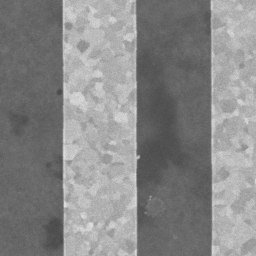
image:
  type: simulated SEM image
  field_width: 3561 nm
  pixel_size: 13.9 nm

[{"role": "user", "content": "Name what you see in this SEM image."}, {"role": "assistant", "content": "wiring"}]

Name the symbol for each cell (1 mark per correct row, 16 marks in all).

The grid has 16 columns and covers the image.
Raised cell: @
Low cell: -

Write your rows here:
----@@@@-----@@@
----@@@@-----@@@
----@@@@-----@@@
----@@@@-----@@@
----@@@@-----@@@
----@@@@-----@@@
----@@@@-----@@@
----@@@@-----@@@
----@@@@-----@@@
----@@@@@----@@@
----@@@@@----@@@
----@@@@@----@@@
----@@@@@----@@@
----@@@@@----@@@
----@@@@@----@@@
----@@@@@----@@@